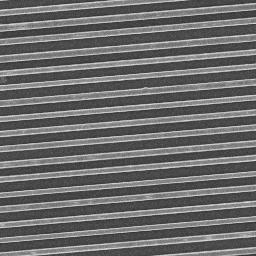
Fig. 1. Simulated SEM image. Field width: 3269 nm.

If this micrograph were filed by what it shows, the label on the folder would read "parallel lines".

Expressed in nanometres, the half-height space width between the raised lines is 118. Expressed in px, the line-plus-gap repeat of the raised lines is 15.1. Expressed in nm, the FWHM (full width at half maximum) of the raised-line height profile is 71.5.